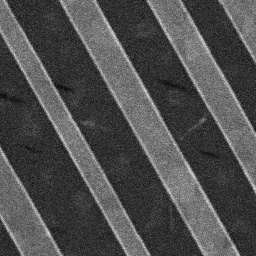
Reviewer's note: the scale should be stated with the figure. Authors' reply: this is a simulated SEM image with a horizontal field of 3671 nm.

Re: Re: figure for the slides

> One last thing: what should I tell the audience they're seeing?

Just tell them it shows one or a few lines or trenches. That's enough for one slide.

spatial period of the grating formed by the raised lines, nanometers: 1070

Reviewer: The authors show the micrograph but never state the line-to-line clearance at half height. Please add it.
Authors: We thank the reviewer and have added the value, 0.696 um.